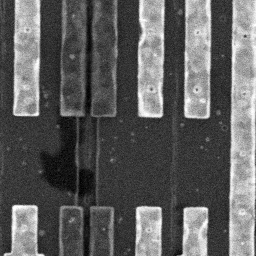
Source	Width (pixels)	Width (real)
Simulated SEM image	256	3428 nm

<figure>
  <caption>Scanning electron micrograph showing wiring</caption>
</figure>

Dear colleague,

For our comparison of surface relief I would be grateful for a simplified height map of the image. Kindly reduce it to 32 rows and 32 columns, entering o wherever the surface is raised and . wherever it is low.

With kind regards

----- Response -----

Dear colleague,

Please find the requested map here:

..ooo...oo..ooo...oo...ooo...ooo
..ooo...oo..oo....oo...ooo...ooo
..ooo...oo..oo....oo...ooo...ooo
..ooo...ooo.ooo...oo...ooo...ooo
..ooo...ooo.ooo...oo...ooo....oo
..ooo...ooo.ooo...oo...ooo...ooo
..ooo...oo..oo...ooo...ooo...ooo
..ooo...oo..oo...ooo...ooo...ooo
..ooo...oo..oo....oo...ooo...ooo
..ooo...oo..oo....oo...ooo...ooo
..ooo...oo..oo....oo...ooo...ooo
..ooo...ooo.oo...ooo...ooo...ooo
..ooo...oo..oo....oo...ooo...ooo
..ooo...oo..oo....oo...ooo...ooo
.......................ooo...ooo
.............................ooo
.............................ooo
.............................ooo
.............................ooo
.............................ooo
.............................ooo
.............................ooo
.............................ooo
.............................ooo
.............................ooo
.............................ooo
..ooo...oo.ooo...ooo...ooo...ooo
..ooo...oo.ooo...ooo...ooo...ooo
..oo....oo..oo...ooo...oo....ooo
..oo....oo..oo...ooo...oo....ooo
..ooo...oo..oo...ooo...ooo...ooo
.oooo...oo.ooo...ooo...ooo...ooo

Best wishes